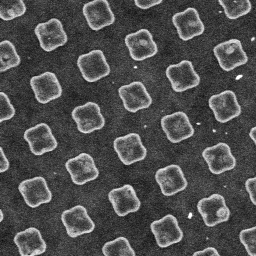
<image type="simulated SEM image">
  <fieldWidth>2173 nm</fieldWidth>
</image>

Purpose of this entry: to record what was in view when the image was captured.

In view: a regular array of raised bodies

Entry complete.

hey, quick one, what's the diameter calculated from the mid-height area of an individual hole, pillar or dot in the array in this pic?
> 250 nanometers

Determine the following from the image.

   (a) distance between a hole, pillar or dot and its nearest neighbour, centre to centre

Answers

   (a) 0.437 um